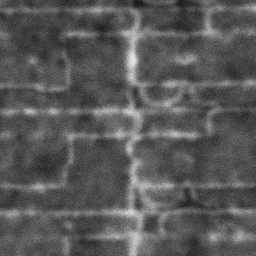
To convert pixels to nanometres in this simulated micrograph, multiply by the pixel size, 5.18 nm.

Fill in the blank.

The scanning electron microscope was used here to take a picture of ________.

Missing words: wiring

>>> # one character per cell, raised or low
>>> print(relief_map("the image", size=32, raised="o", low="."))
................................
ooooooooooooooooo.........oooooo
ooooooooooooooooo.........oooooo
ooooooooooooooooo.........oooooo
oooooooo.........ooooooooooooooo
oooooooo.........ooooooooooooooo
oooooooo.........ooooooooooooooo
oooooooo.........ooooooooooooooo
ooooooooo........ooooooooooooooo
ooooooooo........ooooooooooooooo
ooooooooo........ooooooooooooooo
................................
................................
................................
ooooooooooooooooo.........oooooo
ooooooooooooooooo.........oooooo
ooooooooooooooooo.........oooooo
ooooooooo.......oooooooooooooooo
ooooooooo.......oooooooooooooooo
ooooooooo.......oooooooooooooooo
ooooooooo........ooooooooooooooo
oooooooo.........ooooooooooooooo
oooooooo.........ooooooooooooooo
................................
................................
................................
.....................ooooooooooo
oooooooooooooooooo..oooooooooooo
oooooooooooooooooo..oooooooooooo
oooooooooooooooo.ooooooooooooooo
oooooooo.........ooooooooooooooo
oooooooo.........ooooooooooooooo